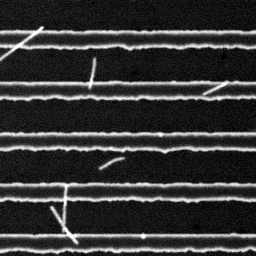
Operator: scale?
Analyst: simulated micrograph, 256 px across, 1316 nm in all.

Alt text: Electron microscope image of lines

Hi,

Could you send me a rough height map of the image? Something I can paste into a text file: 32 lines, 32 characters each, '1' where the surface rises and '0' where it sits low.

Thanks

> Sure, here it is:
00000000000000000000000000000000
00000000000000000000000000000000
00000000000000000000000000000000
00000000000000000000000000000000
11111111111111111111111111111111
11111111111111111111111111111111
00000000000000000000000000000000
00000000000000000000000000000000
00000000000000000000000000000000
00000000000000000000000000000000
11111111111111111111111111111111
11111111111111111111111111111111
01010000000000000000000000100000
00000000000000000000000000000000
00000000000000000000000000000000
00000000000000000000000000000000
00000000000000000000000000000000
11111111111111111111111111111111
11111111111111111111111111111111
00000000000000000000000000000000
00000000000000000000000000000000
00000000000000000000000000000000
00000000000000000000000000000000
11111111111111111111111111111111
11111111111111111111111111111111
00000000000000000000000000000000
00000000000000000000000000000000
00000000000000000000000000000000
00000000000000000000000000000000
11111111111111111111111111111111
11111111111111111111111111111111
10001111001000100000000000000000